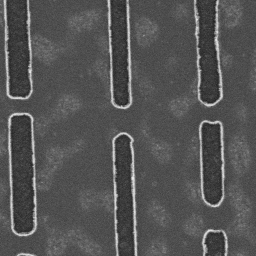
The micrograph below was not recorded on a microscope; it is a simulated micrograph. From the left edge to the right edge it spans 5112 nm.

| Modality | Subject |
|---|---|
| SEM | one or a few lines or trenches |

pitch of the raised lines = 1890 nm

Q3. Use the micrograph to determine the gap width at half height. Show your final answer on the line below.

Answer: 74.6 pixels